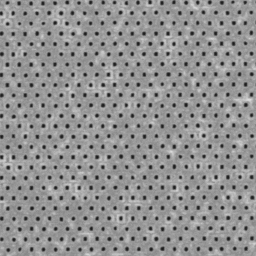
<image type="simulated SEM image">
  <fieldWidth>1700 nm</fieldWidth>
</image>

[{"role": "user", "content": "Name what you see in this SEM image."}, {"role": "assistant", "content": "a regular array of holes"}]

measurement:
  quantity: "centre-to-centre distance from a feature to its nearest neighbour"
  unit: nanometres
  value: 76.3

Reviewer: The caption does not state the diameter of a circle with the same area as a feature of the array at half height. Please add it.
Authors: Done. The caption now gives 4.14 pixels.